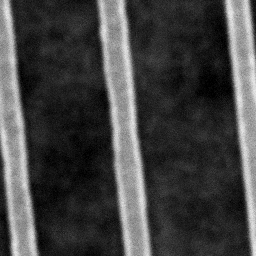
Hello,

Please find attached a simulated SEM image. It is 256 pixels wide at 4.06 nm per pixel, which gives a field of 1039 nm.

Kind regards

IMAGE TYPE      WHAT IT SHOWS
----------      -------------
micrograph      one or a few lines or trenches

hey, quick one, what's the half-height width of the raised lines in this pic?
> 85.2 nanometres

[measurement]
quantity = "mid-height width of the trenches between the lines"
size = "400 nanometers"